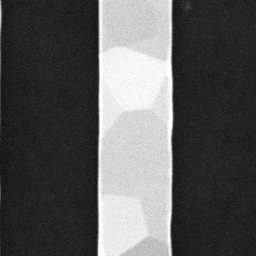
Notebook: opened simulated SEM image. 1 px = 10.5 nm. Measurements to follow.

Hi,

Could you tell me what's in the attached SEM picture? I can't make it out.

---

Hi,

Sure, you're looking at wiring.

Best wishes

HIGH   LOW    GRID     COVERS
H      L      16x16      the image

LLLLLLHHHHHLLLLL
LLLLLLHHHHHLLLLL
LLLLLLHHHHHLLLLL
LLLLLLHHHHHLLLLL
LLLLLLHHHHHLLLLL
LLLLLLHHHHHLLLLL
LLLLLLHHHHHLLLLL
LLLLLLHHHHHLLLLL
LLLLLLHHHHHLLLLL
LLLLLLHHHHHLLLLL
LLLLLLHHHHHLLLLL
LLLLLLHHHHHLLLLL
LLLLLLHHHHHLLLLL
LLLLLLHHHHHLLLLL
LLLLLLHHHHHLLLLL
LLLLLLHHHHHLLLLL